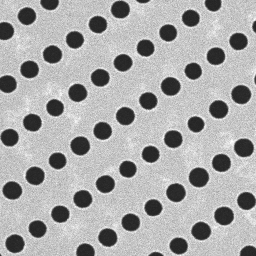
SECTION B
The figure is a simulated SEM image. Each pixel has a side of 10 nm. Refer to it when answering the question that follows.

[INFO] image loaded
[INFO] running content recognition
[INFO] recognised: a regular array of holes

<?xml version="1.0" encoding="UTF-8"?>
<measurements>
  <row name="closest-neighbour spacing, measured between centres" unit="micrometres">0.271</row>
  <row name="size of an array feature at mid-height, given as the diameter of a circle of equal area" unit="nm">187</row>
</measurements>